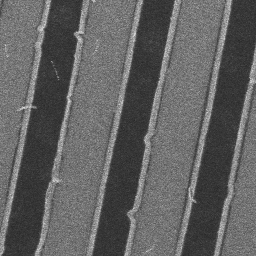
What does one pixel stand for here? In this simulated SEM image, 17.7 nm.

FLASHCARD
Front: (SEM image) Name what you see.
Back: one or a few lines or trenches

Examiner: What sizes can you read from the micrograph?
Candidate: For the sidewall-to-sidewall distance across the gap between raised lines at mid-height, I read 881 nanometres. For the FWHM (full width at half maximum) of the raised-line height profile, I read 677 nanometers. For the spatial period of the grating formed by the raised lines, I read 1.56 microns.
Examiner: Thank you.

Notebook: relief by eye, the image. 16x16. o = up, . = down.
...oo....oo...oo
...oo...ooo...oo
..ooo...ooo...oo
..ooo...oo....oo
..ooo...oo...ooo
..oo....oo...ooo
..oo...ooo...oo.
..oo...ooo...oo.
.ooo...oo....oo.
.ooo...oo...ooo.
.ooo...oo...ooo.
.oo...ooo...oo..
.oo...ooo...oo..
ooo...oo....oo..
ooo...oo...ooo..
oo....oo...ooo..